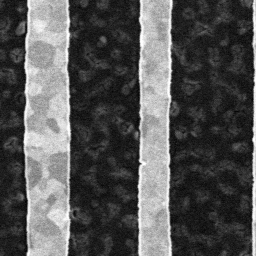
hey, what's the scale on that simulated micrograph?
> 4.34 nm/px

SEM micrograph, one or a few lines or trenches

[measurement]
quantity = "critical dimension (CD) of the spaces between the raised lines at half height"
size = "341 nm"